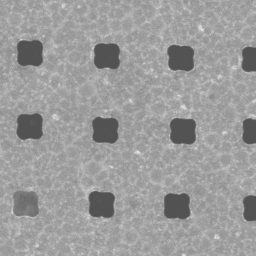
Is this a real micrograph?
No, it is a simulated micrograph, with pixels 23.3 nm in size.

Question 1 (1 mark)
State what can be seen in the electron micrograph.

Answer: a regular array of holes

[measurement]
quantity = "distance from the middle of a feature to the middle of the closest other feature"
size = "1720 nm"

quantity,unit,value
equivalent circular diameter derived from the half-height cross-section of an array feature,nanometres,654